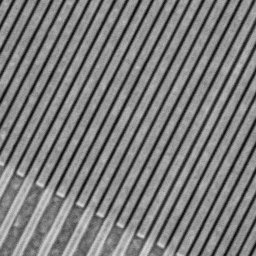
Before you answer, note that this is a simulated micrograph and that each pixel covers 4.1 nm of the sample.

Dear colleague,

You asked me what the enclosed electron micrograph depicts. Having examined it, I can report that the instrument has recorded parallel lines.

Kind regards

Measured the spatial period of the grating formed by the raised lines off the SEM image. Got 46 nm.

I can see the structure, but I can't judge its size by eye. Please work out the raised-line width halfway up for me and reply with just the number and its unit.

32.4 nm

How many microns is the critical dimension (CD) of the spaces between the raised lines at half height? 0.0123